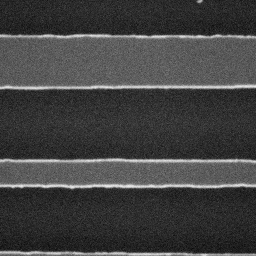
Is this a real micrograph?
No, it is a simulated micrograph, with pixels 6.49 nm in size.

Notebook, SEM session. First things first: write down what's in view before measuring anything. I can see lines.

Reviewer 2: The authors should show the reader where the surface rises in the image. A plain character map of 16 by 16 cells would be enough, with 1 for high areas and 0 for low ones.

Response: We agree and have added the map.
0000000000000000
0000000000000000
1111111111111111
1111111111111111
1111111111111111
0010000000000000
0000000000000000
0000000000000000
0000000000000000
0000000000000000
1111111111111111
1111111111111111
0000000000000000
0000000000000000
0000000000000000
0000000000000000